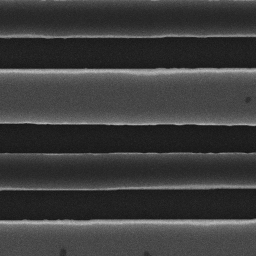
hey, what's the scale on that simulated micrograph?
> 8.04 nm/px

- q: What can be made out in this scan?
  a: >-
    lines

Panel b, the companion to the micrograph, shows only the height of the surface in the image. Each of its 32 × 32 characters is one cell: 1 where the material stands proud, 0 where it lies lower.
11111111111111111111111111111111
11111111111111111111111111111111
11111111111111111111111111111111
11111111111111111111111111111111
11111111111111111111111111111111
00000000000000000000000000000000
00000000000000000000000000000000
00000000000000000000000000000000
00000000000000000000000000000000
11111111111111111111111111111111
11111111111111111111111111111111
11111111111111111111111111111111
11111111111111111111111111111111
11111111111111111111111111111111
11111111111111111111111111111111
00000000000001111111001011111111
00000000000000000000000000000000
00000000000000000000000000000000
00000000000000000000000000000000
11111111111111111111111111111111
11111111111111111111111111111111
11111111111111111111111111111111
11111111111111111111111111111111
11111111111111111111111111111111
00000000000000000000000000000000
00000000000000000000000000000000
00000000000000000000000000000000
00000000000000000000000000000001
11111111111111111111111111111111
11111111111111111111111111111111
11111111111111111111111111111111
11111111111111111111111111111111